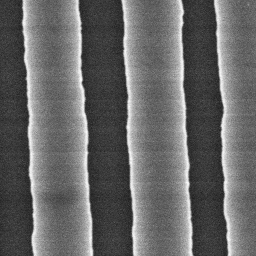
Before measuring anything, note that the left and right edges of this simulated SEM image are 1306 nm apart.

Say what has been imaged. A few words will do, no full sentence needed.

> lines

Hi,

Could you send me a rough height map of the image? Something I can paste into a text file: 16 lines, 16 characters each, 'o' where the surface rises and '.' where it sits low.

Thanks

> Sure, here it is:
.oooo...ooo..ooo
.oooo...ooo...oo
..ooo...ooo...oo
..ooo...ooo...oo
..ooo...ooo...oo
..ooo...ooo...oo
..ooo...oooo..oo
..ooo...oooo..oo
..ooo...oooo..oo
..ooo...oooo..oo
..ooo...oooo..oo
..oooo..oooo..oo
..oooo..oooo..oo
..oooo..oooo..oo
..oooo..oooo..oo
..oooo..oooo..oo